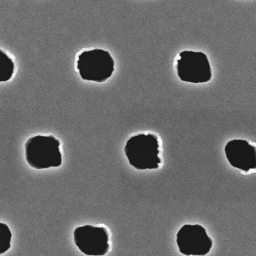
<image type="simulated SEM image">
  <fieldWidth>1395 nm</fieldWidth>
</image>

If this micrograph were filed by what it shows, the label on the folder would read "holes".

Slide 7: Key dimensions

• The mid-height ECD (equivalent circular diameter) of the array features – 185 nm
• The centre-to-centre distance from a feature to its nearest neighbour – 540 nm